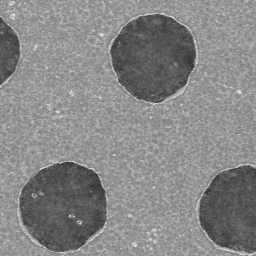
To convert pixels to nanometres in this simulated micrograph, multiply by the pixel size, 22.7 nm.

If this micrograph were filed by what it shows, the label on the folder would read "holes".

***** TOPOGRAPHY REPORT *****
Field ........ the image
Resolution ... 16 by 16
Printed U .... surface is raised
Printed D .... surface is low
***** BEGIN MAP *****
UUUUUUUUUUUUUUUU
UUUUUUUUDDDUUUUU
DUUUUUUDDDDDUUUU
DUUUUUUDDDDDUUUU
DUUUUUUDDDDDUUUU
UUUUUUUUDDDUUUUU
UUUUUUUUUUUUUUUU
UUUUUUUUUUUUUUUU
UUUUUUUUUUUUUUUU
UUUUUUUUUUUUUUUU
UUUDDDUUUUUUUUUD
UUDDDDUUUUUUUDDD
UDDDDDDUUUUUUDDD
UDDDDDDUUUUUDDDD
UUDDDDUUUUUUUDDD
UUUDDUUUUUUUUUDD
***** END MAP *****